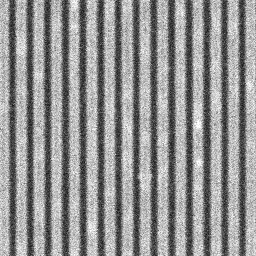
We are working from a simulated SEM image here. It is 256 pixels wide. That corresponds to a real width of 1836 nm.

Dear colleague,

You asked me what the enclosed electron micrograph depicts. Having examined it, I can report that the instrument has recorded parallel lines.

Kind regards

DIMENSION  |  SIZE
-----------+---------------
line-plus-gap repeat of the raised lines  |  127 nanometers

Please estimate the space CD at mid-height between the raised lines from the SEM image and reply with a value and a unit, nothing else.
59.2 nm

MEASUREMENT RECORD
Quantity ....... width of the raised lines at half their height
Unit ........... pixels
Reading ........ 9.25